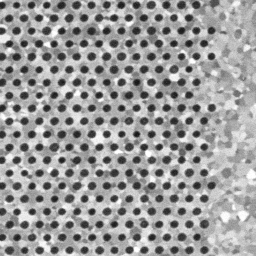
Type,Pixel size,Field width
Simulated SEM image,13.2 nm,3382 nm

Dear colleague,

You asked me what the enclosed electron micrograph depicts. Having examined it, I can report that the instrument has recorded a regular array of holes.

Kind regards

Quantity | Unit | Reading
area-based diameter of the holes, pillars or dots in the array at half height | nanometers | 116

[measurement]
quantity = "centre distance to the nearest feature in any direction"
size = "192 nanometers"